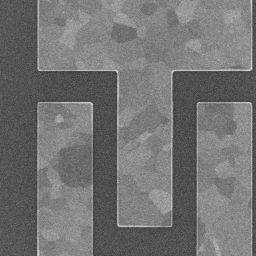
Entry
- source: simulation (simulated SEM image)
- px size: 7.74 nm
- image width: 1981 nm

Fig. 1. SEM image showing groups of lines, slits or small figures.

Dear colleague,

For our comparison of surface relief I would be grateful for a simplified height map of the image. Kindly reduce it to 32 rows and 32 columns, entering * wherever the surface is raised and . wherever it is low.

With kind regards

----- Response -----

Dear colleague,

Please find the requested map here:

.....**************************.
.....**************************.
.....**************************.
.....**************************.
.....**************************.
.....**************************.
.....**************************.
.....**************************.
.....**************************.
...............******...........
...............******...........
...............******...........
...............******...........
.....******....******....******.
.....******....******....******.
.....******....******....******.
.....******....******....******.
.....******....******....******.
.....******....******....******.
.....******....******....******.
.....******....******....******.
.....******....******....******.
.....******....******....******.
.....******....******....******.
.....******....******....******.
.....******....******....******.
.....******....******....******.
.....******....******....******.
.....******..............******.
.....******..............******.
.....******..............******.
.....******..............******.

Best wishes